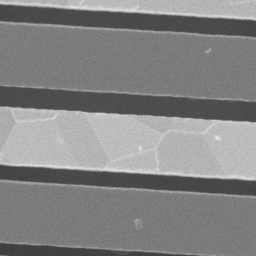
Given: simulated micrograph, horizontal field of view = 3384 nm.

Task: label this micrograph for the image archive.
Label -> lines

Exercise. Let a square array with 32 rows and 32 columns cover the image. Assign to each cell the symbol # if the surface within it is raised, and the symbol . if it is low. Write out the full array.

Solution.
################################
...............#################
...............................#
#############...................
#############################...
################################
################################
################################
################################
################################
################################
...........#####################
...........................#####
##..............................
####################............
################################
################################
################################
################################
################################
################################
................################
##.............................#
#################...............
################################
################################
################################
################################
################################
################################
...#############################
...................#############